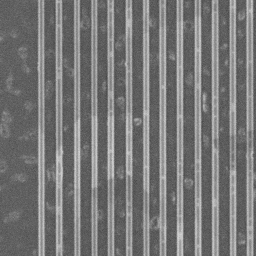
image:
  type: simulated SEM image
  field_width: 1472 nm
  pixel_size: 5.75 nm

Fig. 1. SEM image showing parallel lines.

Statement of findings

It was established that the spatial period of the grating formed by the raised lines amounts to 0.0999 micrometres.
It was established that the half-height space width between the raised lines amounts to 73.3 nm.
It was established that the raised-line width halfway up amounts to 29.5 nanometers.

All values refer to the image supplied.